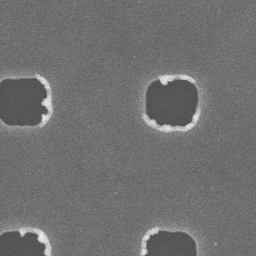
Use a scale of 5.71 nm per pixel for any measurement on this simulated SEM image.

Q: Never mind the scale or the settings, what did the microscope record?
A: holes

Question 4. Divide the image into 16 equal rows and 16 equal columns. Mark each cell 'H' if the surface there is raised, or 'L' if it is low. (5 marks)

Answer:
HHHHHHHHHHHHHHHH
HHHHHHHHHHHHHHHH
HHHHHHHHHHHHHHHH
HHHHHHHHHHHHHHHH
HHHHHHHHHHHHHHHH
LLLHHHHHHLLLHHHH
LLLHHHHHHLLLHHHH
LLLHHHHHHHLLHHHH
HHHHHHHHHHHHHHHH
HHHHHHHHHHHHHHHH
HHHHHHHHHHHHHHHH
HHHHHHHHHHHHHHHH
HHHHHHHHHHHHHHHH
HHHHHHHHHHHHHHHH
HHHHHHHHHHLHHHHH
LLLHHHHHHLLLHHHH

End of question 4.